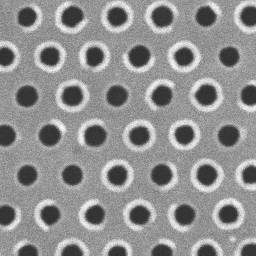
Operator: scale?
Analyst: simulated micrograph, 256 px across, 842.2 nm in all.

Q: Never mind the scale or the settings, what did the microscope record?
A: a regular array of holes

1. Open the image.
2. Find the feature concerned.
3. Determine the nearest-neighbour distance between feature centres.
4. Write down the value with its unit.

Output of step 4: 0.146 microns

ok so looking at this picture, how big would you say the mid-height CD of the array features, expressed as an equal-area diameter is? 0.0675 um